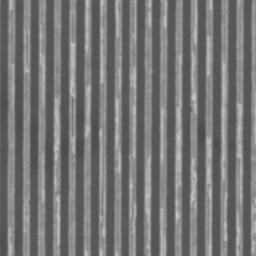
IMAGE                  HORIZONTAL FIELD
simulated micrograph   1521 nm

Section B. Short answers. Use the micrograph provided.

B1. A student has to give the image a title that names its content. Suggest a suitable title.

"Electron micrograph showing parallel lines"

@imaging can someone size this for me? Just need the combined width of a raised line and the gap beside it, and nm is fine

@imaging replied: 90.3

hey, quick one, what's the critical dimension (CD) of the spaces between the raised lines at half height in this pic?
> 56.4 nm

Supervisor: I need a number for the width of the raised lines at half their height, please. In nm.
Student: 35.6